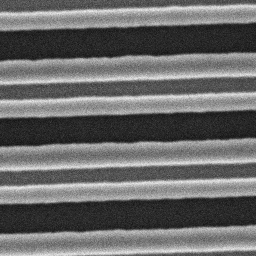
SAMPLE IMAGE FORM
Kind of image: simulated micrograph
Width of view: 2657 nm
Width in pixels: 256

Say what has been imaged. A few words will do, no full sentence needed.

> lines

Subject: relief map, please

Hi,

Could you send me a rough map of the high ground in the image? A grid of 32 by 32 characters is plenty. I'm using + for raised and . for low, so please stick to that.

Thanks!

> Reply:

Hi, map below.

++++++++++++++++++++++++++++++++
++++++++++++++++++++++++++++++++
++++++++++++++++++++++++++++++++
+++++++.........................
................................
................................
................................
.....+++++++++++++++++++++++++++
++++++++++++++++++++++++++++++++
++++++++++++++++++++++++++++++++
++++++++++++++++++++++++++++++++
++++++++++++++++++++++++++++++++
++++++++++++++++++++++++++++++++
++++++++++++++++++++++++++++++++
++++++..........................
................................
................................
............................++++
++++++++++++++++++++++++++++++++
++++++++++++++++++++++++++++++++
++++++++++++++++++++++++++++++++
++++++++++++++++++++++++++++++++
++++++++++++++++++++++++++++++++
++++++++++++++++++++++++++++++++
++++++++++++++++++++++++++++....
................................
................................
................................
.........................+++++++
++++++++++++++++++++++++++++++++
++++++++++++++++++++++++++++++++
++++++++++++++++++++++++++++++++